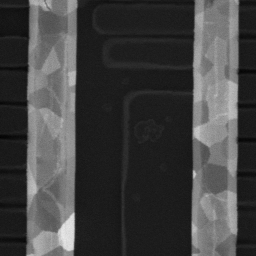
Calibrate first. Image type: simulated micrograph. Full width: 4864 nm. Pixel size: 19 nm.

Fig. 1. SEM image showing wiring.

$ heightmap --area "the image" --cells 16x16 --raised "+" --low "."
..+++.......+++.
..++........+++.
..++........+++.
..++........+++.
..++........+++.
..++........+++.
..++........+++.
..++........+++.
..++........+++.
..++........+++.
..++........+++.
..++........+++.
..++........+++.
..++........+++.
..++........+++.
..++........+++.